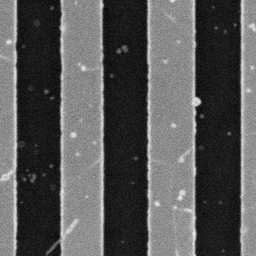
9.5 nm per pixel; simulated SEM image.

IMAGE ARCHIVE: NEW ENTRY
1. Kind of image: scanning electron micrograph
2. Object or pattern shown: lines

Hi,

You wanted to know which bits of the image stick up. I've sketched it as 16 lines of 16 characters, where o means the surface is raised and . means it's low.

o...oo...ooo...o
o...oo...ooo...o
o...oo...ooo...o
o...oo...ooo...o
o...oo...ooo...o
o...oo...ooo...o
o...oo...ooo...o
o...oo...ooo...o
o...oo...ooo...o
o...oo...ooo...o
o...oo...ooo...o
o...oo...ooo...o
o...oo...ooo...o
o...oo...ooo...o
o...oo...ooo...o
o...oo...ooo...o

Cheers